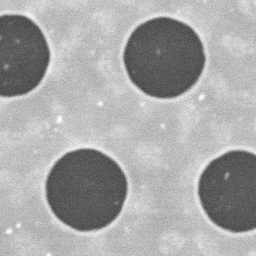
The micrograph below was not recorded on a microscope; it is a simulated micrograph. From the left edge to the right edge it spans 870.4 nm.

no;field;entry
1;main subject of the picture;holes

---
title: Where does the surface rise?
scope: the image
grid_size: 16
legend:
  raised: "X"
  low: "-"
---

XXXXXXXXXXXXXXXX
--XXXXXXX---XXXX
---XXXXX-----XXX
---XXXXX-----XXX
---XXXXX-----XXX
--XXXXXXX---XXXX
XXXXXXXXXXXXXXXX
XXXXXXXXXXXXXXXX
XXXXXXXXXXXXXXXX
XXXX--XXXXXXXX--
XXX-----XXXXX---
XXX-----XXXX----
XXX-----XXXX----
XXX----XXXXXX---
XXXXXXXXXXXXXXXX
XXXXXXXXXXXXXXXX